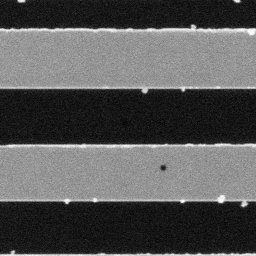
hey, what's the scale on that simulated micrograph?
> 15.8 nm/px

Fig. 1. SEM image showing lines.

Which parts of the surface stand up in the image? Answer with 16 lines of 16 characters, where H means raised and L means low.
LLLLLLLLLLLLLLLL
LLLLLLLLLLLLLLLL
HHHHHHHHHHHHHHHH
HHHHHHHHHHHHHHHH
HHHHHHHHHHHHHHHH
HHHHHHHHHHHHHHHH
LLLLLLLLLLLLLLLL
LLLLLLLLLLLLLLLL
LLLLLLLLLLLLLLLL
HHHHHHHHHHHHHHHH
HHHHHHHHHHHHHHHH
HHHHHHHHHHHHHHHH
HHHHHHHHHHHHHHHH
LLLLLLLLLLLLLLLL
LLLLLLLLLLLLLLLL
LLLLLLLLLLLLLLLL